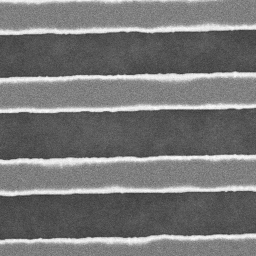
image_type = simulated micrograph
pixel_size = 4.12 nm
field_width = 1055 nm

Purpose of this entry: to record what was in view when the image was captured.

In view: lines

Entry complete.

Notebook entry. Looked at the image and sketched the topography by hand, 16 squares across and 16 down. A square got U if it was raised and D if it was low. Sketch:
UUUUUUUUUUUUUUUU
UUUUUUUUUUUUUUUU
DDDDDDDDDDDDDDDD
DDDDDDDDDDDDDDDD
DDDDDDDDDDDDDDDD
UUUUUUUUUUUUUUUU
UUUUUUUUUUUUUUUU
DDDDDDDDDDDDDDDD
DDDDDDDDDDDDDDDD
DDDDDDDDDDDDDDDD
UUUUUUUUUUUUUUUU
UUUUUUUUUUUUUUUU
DDDDDDDDDDDDDDDD
DDDDDDDDDDDDDDDD
DDDDDDDDDDDDDDDD
UUUUUUUUUUUUUUUU